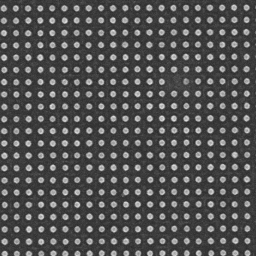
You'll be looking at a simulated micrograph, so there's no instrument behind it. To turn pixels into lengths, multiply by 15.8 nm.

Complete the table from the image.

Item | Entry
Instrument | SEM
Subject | a regular array of raised bodies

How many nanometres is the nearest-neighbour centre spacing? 187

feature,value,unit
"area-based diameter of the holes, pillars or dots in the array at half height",87.2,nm